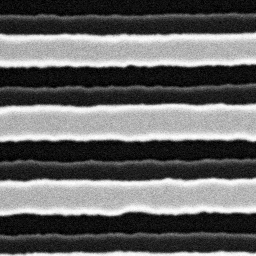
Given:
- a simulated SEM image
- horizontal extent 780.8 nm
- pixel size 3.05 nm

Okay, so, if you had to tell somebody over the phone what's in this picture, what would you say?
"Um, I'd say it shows lines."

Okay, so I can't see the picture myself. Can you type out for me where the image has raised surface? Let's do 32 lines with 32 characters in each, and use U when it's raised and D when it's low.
DDDDDDDDDDDDDDDDDDDDDDDDDDDDDDDD
DDDDDDDDDDDDDDDDDDDDDDDDDDDDDDDD
DDDDDDDDDDDDDDDDDDDDDDDDDDDDDDDD
DDDDDDDDDDDDDDDDDDDDDDDDDDDDDDDD
UUUUUUUUUUUUDDUUUUUUUUUUUUUUUUUU
UUUUUUUUUUUUUUUUUUUUUUUUUUUUUUUU
UUUUUUUUUUUUUUUUUUUUUUUUUUUUUUUU
UUUUUUUUUUUUUUUUUUUUUUUUUUUUUUUU
DDDDDDDDDDDDDDDDDDDDDDDDDDDDDDDD
DDDDDDDDDDDDDDDDDDDDDDDDDDDDDDDD
DDDDDDDDDDDDDDDDDDDDDDDDDDDDDDDD
DDDDDDDDDDDDDDDDDDDDDDDDDDDDDDDD
DDDDDDDDDDDDDDDDDDDDDDDDDDDDDDDD
UUUUUUUUUUUUUUUUUUUUUUUUUUUUUUUU
UUUUUUUUUUUUUUUUUUUUUUUUUUUUUUUU
UUUUUUUUUUUUUUUUUUUUUUUUUUUUUUUU
UUUUUUUUUUUUUUUUUUUUUUUUUUUUUUUU
UUUDUDUUDUUDDDDUUUUDDDDDDDDDDDDU
DDDDDDDDDDDDDDDDDDDDDDDDDDDDDDDD
DDDDDDDDDDDDDDDDDDDDDDDDDDDDDDDD
DDDDDDDDDDDDDDDDDDDDDDDDDDDDDDDD
DDDDDDDDDDDDDDDDDDDDDDDDDDDDDDDD
DDDDDUDDDDDDDDDDDDDDUUUDUUUUUUUU
UUUUUUUUUUUUUUUUUUUUUUUUUUUUUUUU
UUUUUUUUUUUUUUUUUUUUUUUUUUUUUUUU
UUUUUUUUUUUUUUUUUUUUUUUUUUUUUUUU
UUUUUUUUUUUUUUUUDDUUUUUUUDUUUUUU
DDDDDDDDDDDDDDDDDDDDDDDDDDDDDDDD
DDDDDDDDDDDDDDDDDDDDDDDDDDDDDDDD
DDDDDDDDDDDDDDDDDDDDDDDDDDDDDDDD
DDDDDDDDDDDDDDDDDDDDDDDDDDDDDDDD
DDDDDDDDDDDDDDDDDDDDDDDDDDDUDDDD